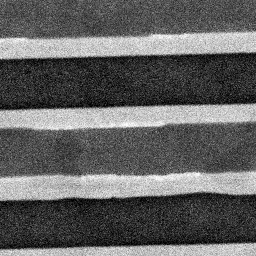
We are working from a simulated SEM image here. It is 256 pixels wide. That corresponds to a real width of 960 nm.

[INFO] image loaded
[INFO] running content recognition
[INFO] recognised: one or a few lines or trenches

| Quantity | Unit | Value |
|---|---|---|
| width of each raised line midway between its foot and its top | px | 68.2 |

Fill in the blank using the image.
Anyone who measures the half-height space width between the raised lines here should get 268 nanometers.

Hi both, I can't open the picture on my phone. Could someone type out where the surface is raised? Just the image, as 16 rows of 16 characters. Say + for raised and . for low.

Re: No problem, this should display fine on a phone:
++++++++++++++++
++++++++++++++++
++++++++++++++++
................
................
................
................
..++++++++++++++
++++++++++++++++
++++++++++++++++
++++++++++++++++
++++++++++......
................
................
................
................